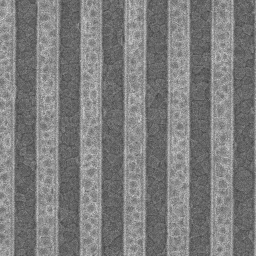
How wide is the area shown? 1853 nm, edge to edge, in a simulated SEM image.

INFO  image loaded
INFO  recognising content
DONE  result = parallel lines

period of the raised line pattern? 316 nm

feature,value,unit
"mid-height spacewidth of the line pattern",173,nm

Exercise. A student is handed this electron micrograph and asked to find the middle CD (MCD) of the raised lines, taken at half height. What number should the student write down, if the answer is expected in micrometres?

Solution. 0.142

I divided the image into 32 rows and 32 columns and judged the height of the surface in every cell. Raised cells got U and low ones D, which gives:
UUDDDUUDDDUUUDDDUUDDDUUUDDDUUDDD
UUDDDUUDDDUUUDDDUUDDDUUUDDDUUDDD
UUDDDUUDDDUUUDDDUUDDDUUUDDDUUDDD
UUDDDUUDDDUUUDDDUUDDDUUUDDDUUDDD
UUDDDUUDDDUUUDDDUUDDDUUUDDDUUDDD
UUDDDUUDDDUUUDDDUUDDDUUUDDDUUDDD
UUDDDUUDDDUUUDDDUUDDDUUUDDDUUDDD
UUDDDUUDDDUUUDDDUUDDDUUUDDDUUDDD
UUDDDUUDDDUUUDDDUUDDDUUDDDDUUDDD
UUDDDUUDDDUUUDDDUUDDDUUDDDDUUDDD
UUDDDUUDDDUUUDDDUUDDDUUDDDDUUDDD
UUDDDUUDDDUUUDDDUUDDDUUDDDDUUDDD
UUDDDUUDDDUUDDDDUUDDDUUDDDDUUDDD
UUDDDUUDDDUUUDDDUUDDDUUDDDDUUDDD
UUDDDUUDDDUUUDDDUUDDDUUDDDDUUDDD
UUDDDUUDDDUUUDDDUUDDDUUDDDDUUDDD
UUDDDUUDDDUUUDDDUUDDDUUDDDDUUDDD
UUDDDUUDDDUUUDDDUUDDDUUDDDDUUDDD
UUDDDUUDDDUUUDDDUUDDDUUDDDDUUDDD
UUDDDUUDDDUUDDDDUUDDDUUDDDDUUDDD
UUDDDUUDDDUUDDDDUUDDDUUDDDDUUDDD
UUDDDUUDDDUUDDDDUUDDDUUDDDDUUDDD
UUDDDUUDDDUUUDDDUUDDDUUDDDDUUDUD
UUDDDUUDDDUUUDDDUUDDDUUDDDDUUDDD
UUDDDUUDDDUUUDDDUUDDDUUDDDDUUDDD
UUDDDUUDDDUUUDDDUUDDDUUDDDDUUDDD
UUDDDUUDDDUUUDDDUUDDDUUDDDDUUDDD
UUDDDUUDDDUUUDDDUUDDDUUDDDDUUDDD
UUDDDUUDDDUUDDDDUUDDDUUDDDDUUDDD
UUDDDUUDDDUUUDDDUUDDDUUDDDDUUDDD
UUDDDUUDDDUUDDDDUUDDDUUDDDDUUDDD
UUDDDUUDDDUUDDDDUUDDDUUDDDDUUDDD